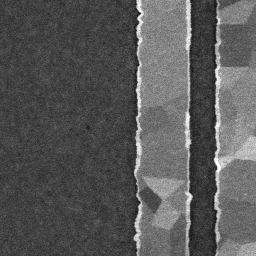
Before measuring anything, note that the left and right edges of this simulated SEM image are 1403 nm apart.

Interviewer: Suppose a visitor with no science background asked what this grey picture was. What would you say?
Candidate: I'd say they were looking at one or a few lines or trenches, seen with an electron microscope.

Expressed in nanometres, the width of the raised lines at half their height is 286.